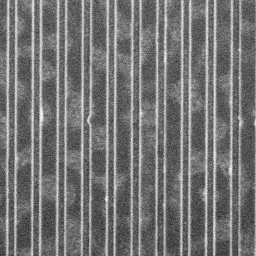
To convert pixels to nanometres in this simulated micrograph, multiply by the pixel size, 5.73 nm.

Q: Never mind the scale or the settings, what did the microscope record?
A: parallel lines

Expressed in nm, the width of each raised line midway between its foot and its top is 105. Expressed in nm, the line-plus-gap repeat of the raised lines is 142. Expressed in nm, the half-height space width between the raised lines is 39.4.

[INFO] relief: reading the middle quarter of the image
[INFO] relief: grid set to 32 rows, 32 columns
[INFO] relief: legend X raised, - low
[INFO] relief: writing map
XXXXX--XXXX--XXXX--XXXX--XXXX---
XXXXX--XXXX--XXXX--XXXX--XXXX---
XXXXX--XXXX--XXXX--XXXX--XXXX---
XXXXX--XXXX--XXXX--XXXX--XXXX---
XXXXX--XXXX--XXXX--XXXX--XXXX---
XXXXX--XXXX--XXXX--XXXX--XXXX---
XXXXX--XXXX--XXXX--XXXX--XXXX---
XXXXX--XXXX--XXXX--XXXX--XXXX---
XXXXX--XXXX--XXXX--XXXX--XXXX---
XXXXX--XXXX--XXXX--XXXX--XXXX---
XXXXX--XXXX--XXXX--XXXX--XXXX---
XXXXX--XXXX--XXXX--XXXX--XXXX---
XXXXX--XXXX--XXXX--XXXX--XXXX---
XXXXX-XXXXX--XXXX--XXXX--XXXX---
XXXXX-XXXXX--XXXX--XXXX--XXXX---
XXXXX--XXXX--XXXX--XXXX--XXXX---
XXXXX--XXXX--XXXX--XXXX--XXXX---
XXXXX--XXXX--XXXX--XXXX--XXXX---
XXXXX--XXXX--XXXX--XXXX--XXXX---
XXXXX--XXXX--XXXX--XXXX--XXXX---
XXXXX--XXXX--XXXX--XXXX--XXXX--X
XXXXX--XXXX--XXXX--XXXX--XXXX--X
XXXXX--XXXX--XXXX--XXXX--XXXX--X
XXXXX--XXXX--XXXX--XXXX--XXXX--X
XXXXX--XXXX--XXXX--XXXX--XXXX--X
XXXXX--XXXX--XXXX--XXXX--XXXX--X
XXXXX--XXXX--XXXX--XXXX--XXXX--X
XXXXX--XXXX--XXXX--XXXX--XXXX--X
XXXXX--XXXX--XXXX--XXXX--XXXX--X
XXXXX--XXXX--XXXX--XXXX--XXXX--X
XXXXX--XXXX--XXXX--XXXX--XXXX--X
XXXXX-XXXXX--XXXX--XXXX--XXXX--X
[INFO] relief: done